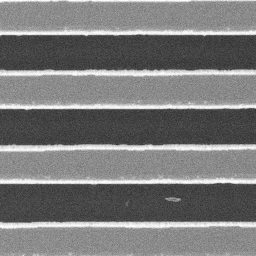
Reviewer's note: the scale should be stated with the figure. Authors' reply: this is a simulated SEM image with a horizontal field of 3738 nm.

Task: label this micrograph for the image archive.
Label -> lines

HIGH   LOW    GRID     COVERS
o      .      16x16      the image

oooooooooooooooo
oooooooooooooooo
................
................
..oo.o....oooooo
oooooooooooooooo
oooooooooooooooo
................
................
oooooooooooooooo
oooooooooooooooo
................
................
................
oooooooooooooooo
oooooooooooooooo